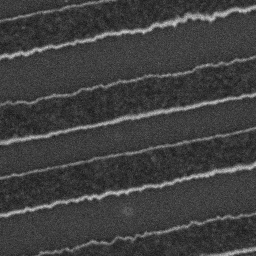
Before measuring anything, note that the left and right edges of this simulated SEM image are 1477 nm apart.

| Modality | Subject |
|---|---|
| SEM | lines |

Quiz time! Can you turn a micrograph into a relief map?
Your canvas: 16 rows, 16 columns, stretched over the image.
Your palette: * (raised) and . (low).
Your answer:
....************
***********.....
******..........
*...............
............****
......**********
*************...
********........
***...........**
.........*******
...************.
***********.....
*****...........
...............*
..........******
.....***********